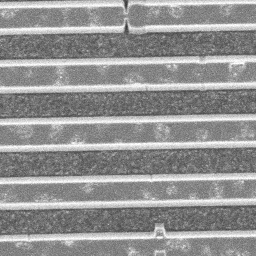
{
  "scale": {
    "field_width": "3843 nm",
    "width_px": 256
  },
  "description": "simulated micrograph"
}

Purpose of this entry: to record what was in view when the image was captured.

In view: parallel lines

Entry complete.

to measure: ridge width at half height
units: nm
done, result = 403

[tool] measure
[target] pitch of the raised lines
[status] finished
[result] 0.876 micrometres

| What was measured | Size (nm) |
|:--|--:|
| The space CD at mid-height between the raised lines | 471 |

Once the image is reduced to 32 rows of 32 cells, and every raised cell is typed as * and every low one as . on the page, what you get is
..........*****.****************
********************************
********************************
***************.*******.........
................................
................................
................................
.........................*******
********************************
********************************
********************************
................................
................................
................................
................................
********************************
********************************
********************************
*****...........................
................................
................................
................................
.......*************************
********************************
********************************
**************..................
................................
................................
................................
...............*****************
********************************
********************************